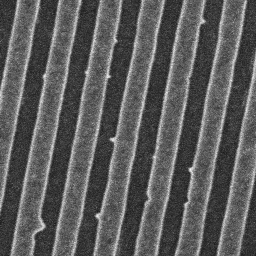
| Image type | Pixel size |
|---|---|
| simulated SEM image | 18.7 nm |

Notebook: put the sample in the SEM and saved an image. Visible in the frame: parallel lines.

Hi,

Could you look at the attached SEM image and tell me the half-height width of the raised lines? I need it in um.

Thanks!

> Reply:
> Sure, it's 0.386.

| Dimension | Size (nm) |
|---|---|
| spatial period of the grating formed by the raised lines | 761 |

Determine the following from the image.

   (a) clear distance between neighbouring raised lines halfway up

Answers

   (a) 370 nm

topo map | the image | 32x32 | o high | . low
..ooo..ooo...oo...oo...oo...ooo.
..ooo..ooo..ooo..ooo...oo...ooo.
..oo...ooo..ooo..ooo..ooo...oo..
..oo...oo...ooo..ooo..ooo...oo..
.ooo...oo...oo...ooo..ooo..ooo..
.ooo..ooo...oo...oo...ooo..ooo..
.ooo..ooo..ooo...oo...oo...ooo..
.ooo..ooo..ooo..ooo...oo...oo...
.oo...oo...ooo..ooo..ooo...oo...
ooo...oo...ooo..ooo..ooo..ooo...
ooo...oo...oo...oo...ooo..ooo..o
ooo..ooo..ooo...oo...oo...ooo..o
ooo..ooo..ooo..ooo...oo...oo...o
oo...ooo..ooo..ooo..ooo...oo...o
oo...oo...ooo..ooo..ooo..ooo...o
oo...oo...oo...oo...ooo..ooo..oo
oo..ooo...oo...oo...ooo..ooo..oo
oo..ooo..ooo..ooo...oo...oo...oo
o...ooo..ooo..ooo...oo...oo...oo
o...oo...ooo..ooo..ooo..ooo...oo
o...oo...oo...oo...ooo..ooo..ooo
o..ooo...oo...oo...ooo..ooo..ooo
o..ooo..ooo...oo...oo...oo...ooo
o..ooo..ooo..ooo...oo...oo...oo.
...oo...ooo..ooo...oo...oo...oo.
...oo...oo...ooo..ooo..ooo..ooo.
..ooo...oo..oooo..ooo..ooo..ooo.
..ooo..ooo..ooo...oo...oo...ooo.
..ooo..ooo..ooo...oo...oo...oo..
..oo...ooo..ooo..ooo..ooo...oo..
..oo...oo...ooo..ooo..ooo..ooo..
.ooo...oo...oo...ooo..ooo..ooo..